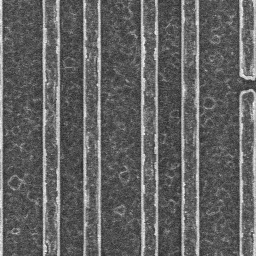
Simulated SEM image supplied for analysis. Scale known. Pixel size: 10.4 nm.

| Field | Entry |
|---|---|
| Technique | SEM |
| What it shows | parallel lines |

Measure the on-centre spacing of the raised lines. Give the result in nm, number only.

511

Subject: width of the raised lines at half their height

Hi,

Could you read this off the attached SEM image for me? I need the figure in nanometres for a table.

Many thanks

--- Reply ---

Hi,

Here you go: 154